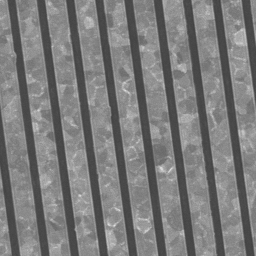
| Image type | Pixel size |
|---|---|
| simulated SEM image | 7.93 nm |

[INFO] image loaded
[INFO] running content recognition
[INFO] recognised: parallel lines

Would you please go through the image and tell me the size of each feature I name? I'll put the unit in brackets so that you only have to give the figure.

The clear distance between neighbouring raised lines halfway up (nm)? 71.7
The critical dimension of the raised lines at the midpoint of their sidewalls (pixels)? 19.8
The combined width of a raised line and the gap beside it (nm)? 230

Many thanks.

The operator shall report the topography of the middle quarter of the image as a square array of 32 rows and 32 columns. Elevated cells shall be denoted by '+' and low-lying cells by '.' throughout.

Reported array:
+++..+++++..+++++..+++++...+++++
+++..+++++..+++++...++++...+++++
+++..+++++..+++++...+++++..+++++
+++..+++++...++++...+++++..+++++
+++..+++++...+++++..+++++...++++
+++...++++...+++++..+++++..+++++
+++...+++++..+++++..+++++...++++
+++...+++++..+++++..+++++...++++
++++..+++++..+++++...++++...++++
++++..+++++..+++++...+++++..++++
++++..+++++...++++...+++++..++++
++++..+++++...+++++..+++++..++++
++++...+++++..+++++..+++++...+++
++++...+++++..+++++..+++++...+++
++++...+++++..+++++..+++++...+++
++++...+++++..+++++..+++++...+++
+++++..+++++..+++++...++++...+++
+++++..+++++..+++++...+++++..+++
+++++..+++++...++++...+++++..+++
+++++..+++++...+++++..+++++..+++
+++++...++++...+++++..+++++..+++
+++++...+++++..+++++..+++++...++
.++++...+++++..+++++..+++++...++
.+++++..+++++..+++++...++++...++
.+++++..+++++..+++++...+++++..++
.+++++..+++++...++++...+++++..++
.+++++..+++++...+++++..+++++..++
.+++++...++++...+++++..+++++...+
.+++++...+++++..+++++..+++++...+
..++++...+++++..+++++..+++++...+
..++++...+++++..+++++..+++++...+
..+++++..+++++..+++++...++++...+